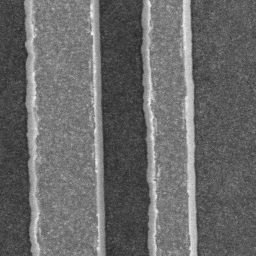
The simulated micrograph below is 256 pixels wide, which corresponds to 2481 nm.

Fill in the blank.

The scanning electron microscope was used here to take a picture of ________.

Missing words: one or a few lines or trenches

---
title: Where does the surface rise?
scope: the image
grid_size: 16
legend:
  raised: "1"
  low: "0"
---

0011110001110000
0011110001110000
0011110001110000
0011110001110000
0011110001110000
0011110001110000
0011110001110000
0011110001110000
0011110001110000
0011110001110000
0011110001110000
0011110001110000
0011110000110000
0011110000110000
0011110001110000
0011110000110000